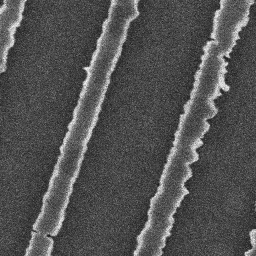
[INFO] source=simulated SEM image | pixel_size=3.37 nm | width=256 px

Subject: one or a few lines or trenches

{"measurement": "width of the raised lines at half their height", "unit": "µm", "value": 0.0769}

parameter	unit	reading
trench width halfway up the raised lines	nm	278